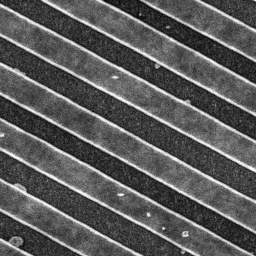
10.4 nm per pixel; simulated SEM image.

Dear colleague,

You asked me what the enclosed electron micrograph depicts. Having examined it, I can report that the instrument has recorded lines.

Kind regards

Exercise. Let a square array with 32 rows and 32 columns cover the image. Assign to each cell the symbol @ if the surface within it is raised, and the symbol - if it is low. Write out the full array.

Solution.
------@@@@@@@-----@@@@@@@@------
@@------@@@@@@@-----@@@@@@@@----
@@@@------@@@@@@@-----@@@@@@@@--
@@@@@@------@@@@@@@-----@@@@@@@-
@@@@@@@@------@@@@@@@-----@@@@@@
--@@@@@@@@-----@@@@@@@@-----@@@@
----@@@@@@@------@@@@@@@@-----@@
------@@@@@@@------@@@@@@@------
@-------@@@@@@@------@@@@@@@----
@@@-------@@@@@@@------@@@@@@@--
@@@@@------@@@@@@@@------@@@@@@@
@@@@@@@------@@@@@@@@-----@@@@@@
-@@@@@@@@------@@@@@@@@-----@@@@
---@@@@@@@-------@@@@@@@@-----@@
-----@@@@@@@-------@@@@@@@------
@------@@@@@@@-------@@@@@@@----
@@@------@@@@@@@-------@@@@@@@--
@@@@@------@@@@@@@-------@@@@@@@
@@@@@@@-----@@@@@@@@------@@@@@@
-@@@@@@@@-----@@@@@@@-------@@@@
---@@@@@@@@-----@@@@@@@-------@@
-----@@@@@@@@-----@@@@@@@-------
-------@@@@@@@------@@@@@@@-----
@@-------@@@@@@@------@@@@@@@---
@@@@-------@@@@@@@-----@@@@@@@@-
@@@@@@-------@@@@@@@-----@@@@@@@
@@@@@@@@------@@@@@@@@-----@@@@@
--@@@@@@@-------@@@@@@@@-----@@@
----@@@@@@@-------@@@@@@@------@
------@@@@@@@-------@@@@@@@-----
@-------@@@@@@@-------@@@@@@@---
@@@------@@@@@@@@-------@@@@@@@-